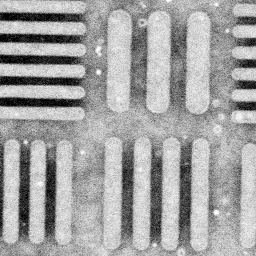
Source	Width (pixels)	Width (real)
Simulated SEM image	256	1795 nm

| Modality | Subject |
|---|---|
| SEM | groups of lines, slits or small figures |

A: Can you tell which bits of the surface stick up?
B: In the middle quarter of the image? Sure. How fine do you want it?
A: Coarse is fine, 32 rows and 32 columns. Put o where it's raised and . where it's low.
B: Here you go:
oooo.......ooooo.....ooooo.....o
ooooo......ooooo.....ooooo.....o
ooooo......ooooo.....ooooo.....o
...........ooooo.....ooooo.....o
...........ooooo.....ooooo.....o
...........ooooo.....ooooo.....o
ooooo......ooooo.....ooooo.....o
ooooo......ooooo.....ooooo.....o
oooo.......ooooo.....ooooo.....o
...........ooooo.....ooooo.....o
...........ooooo.....ooooo.....o
ooooo.......ooo.......ooo......o
ooooo...........................
ooooo...........................
................................
................................
................................
................................
................................
o..........ooo....ooo....oooo...
oo.........ooo....oooo...oooo...
oo.........ooo....oooo...oooo...
oo.........ooo....oooo...oooo...
oo.........ooo....oooo...oooo...
oo.........ooo....oooo...oooo...
oo.........ooo....ooo....oooo...
oo.........ooo....ooo....oooo...
oo.........ooo....ooo....oooo...
oo........oooo....ooo....oooo...
oo........oooo....ooo....oooo...
oo........oooo....ooo....oooo...
oo........oooo....ooo....oooo...